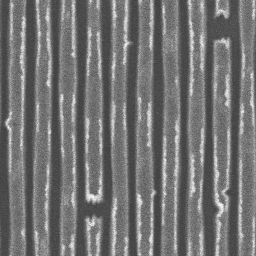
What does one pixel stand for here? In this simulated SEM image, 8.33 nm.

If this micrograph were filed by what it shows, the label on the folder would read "parallel lines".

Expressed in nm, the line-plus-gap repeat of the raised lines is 213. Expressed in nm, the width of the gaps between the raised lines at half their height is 78.1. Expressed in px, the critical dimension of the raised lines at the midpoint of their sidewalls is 16.1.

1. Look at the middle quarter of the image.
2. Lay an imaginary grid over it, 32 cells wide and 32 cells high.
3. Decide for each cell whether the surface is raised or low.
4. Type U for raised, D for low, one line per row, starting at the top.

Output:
UUUDDDUUUDDDUUUUDDDUUUDDDUUUUDDD
UUUDDDUUUDDDUUUUDDDUUUDDDUUUUDDD
UUUDDDUUUDDDUUUUDDDUUUDDDUUUUDDD
UUUDDUUUUDDDUUUUDDUUUUDDDUUUUDDU
UUUDDUUUUDDDUUUUDDUUUUDDDUUUUDDU
UUUDDUUUUDDDUUUUDDUUUUDDDUUUUDDU
UUUDDUUUUDDDUUUDDDUUUUDDDUUUUDDU
UUUDDUUUUUDDUUUDDDUUUUDDDUUUUDDU
UUUDDUUUUUDDUUUDDDUUUUDDDUUUUDDU
UUUDDUUUUUDDUUUDDDUUUUDDDUUUUDDU
UUUDDUUUUUDDUUUDDDUUUUDDDUUUUDDU
UUUDDUUUUUDDUUUDDDUUUUDDDUUUUDDU
UUUDDUUUUUDDUUUDDDUUUUDDDUUUUDDU
UUUDDUUUUUDDUUUUDDUUUUDDDUUUUDDU
UUUDDUUUUUDDUUUUDDUUUUDDDUUUUDDU
UUUDDUUUUUDDUUUUDDUUUUDDDUUUUDDU
UUUDDUUUUUDDUUUUDDUUUUDDDUUUUDDU
UUUDDUUUUUDDUUUUDDUUUUDDDUUUUDDU
UUUDDUUUUUDDUUUUDDUUUUDDDUUUUDDU
UUUDDUUUUUDDUUUUDDUUUUDDDUUUUDDU
UUUDDUUUUUDDUUUUDDUUUUDDDUUUUDDU
UUUDDUUUUUDDUUUUDDUUUUDDDUUUUDDU
UUUDDUUUUUDDUUUUDDUUUUDDDUUUUDDU
UUUDDUUUUUDDUUUUDDUUUUDDDUUUUDDU
UUUDDUUUUUDDUUUUDDUUUUDDDUUUUDDU
UUUDDUUUUUDDUUUUDDUUUUDDDUUUUDDU
UUUDDUUUUUDDUUUUDDUUUUDDUUUUUDDU
UUUDDUUUUUDDUUUUDDUUUUDDUUUUUDDU
UUUDDUUUUUDDUUUUDDUUUUDDUUUUUDDU
UUUDDUUUUUDDUUUUDDUUUUDDUUUUDDDU
UUUDDDUUUUDDUUUUDDUUUUUDUUUUDDDU
UUUDDUUUUUDDUUUUDDUUUUUDUUUUDDDU